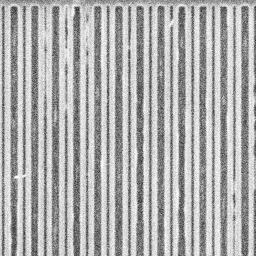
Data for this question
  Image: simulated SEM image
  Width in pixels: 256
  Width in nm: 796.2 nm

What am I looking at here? parallel lines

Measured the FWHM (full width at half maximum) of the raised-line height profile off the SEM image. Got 0.0152 um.